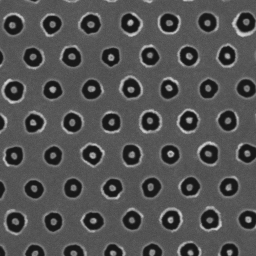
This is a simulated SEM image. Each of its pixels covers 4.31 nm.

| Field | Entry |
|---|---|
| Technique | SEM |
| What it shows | a regular array of ring-shaped grooves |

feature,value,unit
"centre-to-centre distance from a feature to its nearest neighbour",162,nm